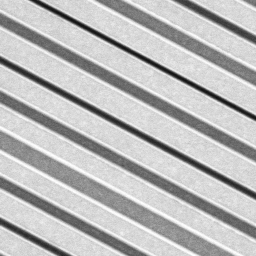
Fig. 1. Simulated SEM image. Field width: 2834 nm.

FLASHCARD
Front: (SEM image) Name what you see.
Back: parallel lines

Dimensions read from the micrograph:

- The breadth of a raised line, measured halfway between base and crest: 265 nanometres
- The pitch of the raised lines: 387 nm